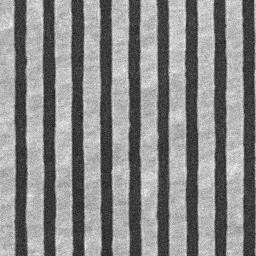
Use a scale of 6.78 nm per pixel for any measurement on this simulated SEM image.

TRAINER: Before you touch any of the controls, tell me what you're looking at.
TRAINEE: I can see parallel lines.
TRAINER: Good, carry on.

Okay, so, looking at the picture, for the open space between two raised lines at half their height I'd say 83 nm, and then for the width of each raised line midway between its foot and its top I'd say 108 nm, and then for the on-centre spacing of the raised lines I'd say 194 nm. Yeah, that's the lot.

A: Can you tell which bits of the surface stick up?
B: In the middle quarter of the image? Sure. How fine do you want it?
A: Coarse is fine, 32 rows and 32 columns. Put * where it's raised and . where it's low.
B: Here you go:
**...****...****...****...****..
**...****...****...****...****..
**...****...****...****...****..
**...****...****...****...****..
**...****...****...****...****..
**...****...****...****...****..
**...****...****...****...****..
**...****...****...****...****..
**...****...****...****...****..
**...****...****...****...****..
**...****...****...****...****..
**...****...****...****...****..
**...****...****...****...****..
**...****...****...****...****..
**...****...****...****...****..
**...****...****...****...****..
**...****...****...****...****..
**...****...****...****...*****.
**...****...****...****....****.
**...****...****...****....***..
**...****...****...****....***..
**...****...****...****....***..
**...****...****...****....***..
**...****...****...****....***..
**...****...****...****....***..
**...****...****...****....***..
**...****...****...****....***..
**...****...****...****....***..
**...****...****...****....****.
**...****...****...****....***..
**...****...****...****....***..
**...****...****...****....***..